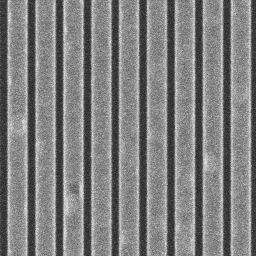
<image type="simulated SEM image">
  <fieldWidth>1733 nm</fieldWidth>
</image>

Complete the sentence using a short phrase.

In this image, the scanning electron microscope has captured parallel lines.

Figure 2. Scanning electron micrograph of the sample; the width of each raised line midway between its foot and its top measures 0.129 microns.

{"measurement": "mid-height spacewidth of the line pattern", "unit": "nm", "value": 58.4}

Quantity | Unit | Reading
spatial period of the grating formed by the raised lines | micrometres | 0.189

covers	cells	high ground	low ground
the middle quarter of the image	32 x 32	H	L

HHHHHLLHHHHHLLHHHHLLLHHHHHLLHHHH
HHHHHLLHHHHHLLHHHHLLLHHHHHLLHHHH
HHHHHLLHHHHHLLHHHHLLLHHHHHLLHHHH
HHHHHLLHHHHHLLHHHHLLLHHHHHLLHHHH
HHHHHLLHHHHHLLHHHHLLLHHHHHLLHHHH
HHHHHLLHHHHHLLHHHHLLLHHHHHLLHHHH
HHHHHLLHHHHHLLHHHHLLLHHHHHLLHHHH
HHHHHLLHHHHHLLHHHHLLLHHHHHLLHHHH
HHHHHLLHHHHHLLHHHHLLLHHHHHLLHHHH
HHHHHLLHHHHHLLHHHHLLLHHHHHLLHHHH
HHHHHLLHHHHHLLHHHHLLLHHHHHLLHHHH
HHHHHLLHHHHHLLHHHHLLLHHHHHLLHHHH
HHHHHLLHHHHHLLHHHHLLLHHHHHLLHHHH
HHHHHLLHHHHHLLHHHHLLLHHHHHLLHHHH
HHHHHLLHHHHHLLHHHHLLLHHHHHLLHHHH
HHHHHLLHHHHHLLHHHHLLLHHHHHLLHHHH
HHHHHLLHHHHHLLHHHHLLLHHHHHLLHHHH
HHHHHLLHHHHHLLHHHHLLLHHHHHLLHHHH
HHHHHLLHHHHHLLHHHHLLLHHHHHLLHHHH
HHHHHLLHHHHHLLHHHHLLLHHHHHLLHHHH
HHHHHLLHHHHHLLHHHHLLLHHHHHLLHHHH
HHHHHLLHHHHHLLHHHHLLLHHHHHLLHHHH
HHHHHLLHHHHHLLHHHHLLLHHHHHLLHHHH
HHHHHLLHHHHHLLHHHHLLLHHHHHLLHHHH
HHHHHLLHHHHHLLHHHHLLLHHHHHLLHHHH
HHHHHLLHHHHHLLHHHHLLLHHHHHLLHHHH
HHHHHLLHHHHHLLHHHHLLLHHHHHLLHHHH
HHHHHLLHHHHHLLHHHHLLLHHHHHLLHHHH
HHHHHLLHHHHHLLHHHHLLLHHHHHLLHHHH
HHHHHLLHHHHHLLHHHHLLLHHHHHLLHHHH
HHHHHLLHHHHHLLHHHHLLLHHHHHLLHHHH
HHHHHLLHHHHHLLHHHHLLLHHHHHLLHHHH